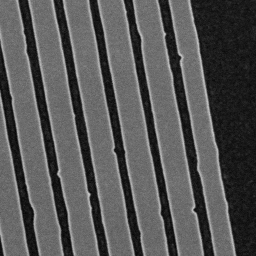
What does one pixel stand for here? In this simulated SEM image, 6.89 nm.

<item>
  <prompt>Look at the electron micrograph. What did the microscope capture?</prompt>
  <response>parallel lines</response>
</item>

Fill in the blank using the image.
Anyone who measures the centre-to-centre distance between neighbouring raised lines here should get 34.2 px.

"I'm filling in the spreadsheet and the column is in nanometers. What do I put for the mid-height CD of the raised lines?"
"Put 170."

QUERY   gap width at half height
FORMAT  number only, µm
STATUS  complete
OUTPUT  0.0653